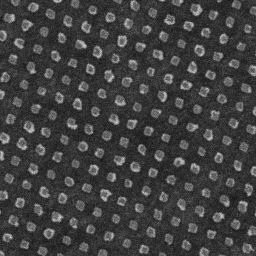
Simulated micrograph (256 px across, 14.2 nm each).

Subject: a regular array of raised bodies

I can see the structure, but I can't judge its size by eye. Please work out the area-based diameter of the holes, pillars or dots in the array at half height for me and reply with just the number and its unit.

130 nm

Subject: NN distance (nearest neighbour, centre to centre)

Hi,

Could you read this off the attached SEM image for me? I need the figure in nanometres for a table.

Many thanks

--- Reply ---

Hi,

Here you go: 259